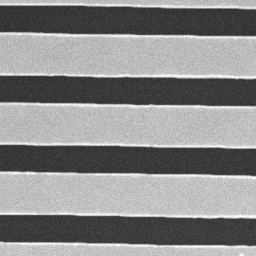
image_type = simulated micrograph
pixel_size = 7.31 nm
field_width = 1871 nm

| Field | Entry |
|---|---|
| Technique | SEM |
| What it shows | lines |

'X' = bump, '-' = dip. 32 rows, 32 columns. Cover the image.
XXXXXXXXXXXXXXXXXXXXXXXXXXXXXXXX
--------------------------------
--------------------------------
--------------------------------
XXXXXXXXXXXXXXXXXXXXXXXXX-------
XXXXXXXXXXXXXXXXXXXXXXXXXXXXXXXX
XXXXXXXXXXXXXXXXXXXXXXXXXXXXXXXX
XXXXXXXXXXXXXXXXXXXXXXXXXXXXXXXX
XXXXXXXXXXXXXXXXXXXXXXXXXXXXXXXX
-----------XXXXXXXXXXXXXXXXXXXXX
--------------------------------
--------------------------------
--------------------------------
XXXXXXXXXXXXXXXXXXXXXXXXXXXXXXXX
XXXXXXXXXXXXXXXXXXXXXXXXXXXXXXXX
XXXXXXXXXXXXXXXXXXXXXXXXXXXXXXXX
XXXXXXXXXXXXXXXXXXXXXXXXXXXXXXXX
XXXXXXXXXXXXXXXXXXXXXXXXXXXXXXXX
--------------------------------
--------------------------------
--------------------------------
--------------------------------
XXXXXXXXXXXXXXXXXXXXXXXXXXXXXXXX
XXXXXXXXXXXXXXXXXXXXXXXXXXXXXXXX
XXXXXXXXXXXXXXXXXXXXXXXXXXXXXXXX
XXXXXXXXXXXXXXXXXXXXXXXXXXXXXXXX
XXXXXXXXXXXXXXXXXXXXXXXXXXXXXXXX
--------------------------------
--------------------------------
--------------------------------
XXXXXXXXX-----------------------
XXXXXXXXXXXXXXXXXXXXXXXXXXXXXXXX